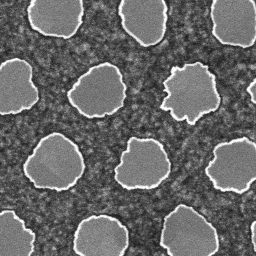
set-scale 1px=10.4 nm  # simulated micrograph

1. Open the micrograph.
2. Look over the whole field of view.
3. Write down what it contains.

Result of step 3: raised bodies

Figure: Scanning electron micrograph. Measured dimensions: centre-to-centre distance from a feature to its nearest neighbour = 85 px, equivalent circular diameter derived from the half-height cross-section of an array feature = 54.1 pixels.